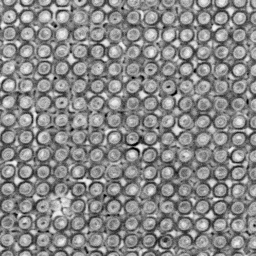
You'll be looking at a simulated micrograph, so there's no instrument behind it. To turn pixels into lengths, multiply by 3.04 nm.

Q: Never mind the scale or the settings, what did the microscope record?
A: a regular array of raised bodies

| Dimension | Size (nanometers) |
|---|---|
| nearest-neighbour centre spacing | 51.5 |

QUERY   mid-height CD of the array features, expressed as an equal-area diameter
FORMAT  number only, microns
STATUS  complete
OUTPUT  0.0353